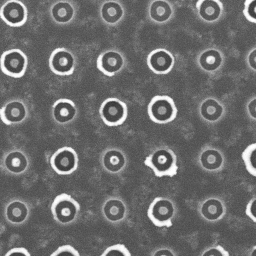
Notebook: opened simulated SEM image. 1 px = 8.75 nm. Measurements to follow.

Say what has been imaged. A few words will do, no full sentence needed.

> a regular array of ring-shaped grooves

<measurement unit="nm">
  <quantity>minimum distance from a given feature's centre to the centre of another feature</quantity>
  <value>428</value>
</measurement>